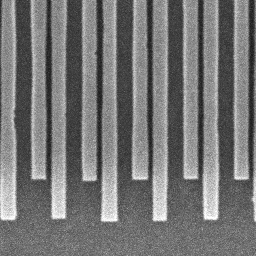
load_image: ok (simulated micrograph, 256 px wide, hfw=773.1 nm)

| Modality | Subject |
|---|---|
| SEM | parallel lines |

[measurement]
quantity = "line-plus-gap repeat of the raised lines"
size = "78.4 nm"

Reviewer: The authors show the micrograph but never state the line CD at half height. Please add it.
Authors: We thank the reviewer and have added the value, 41.2 nm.